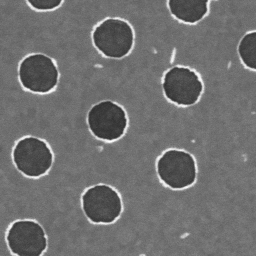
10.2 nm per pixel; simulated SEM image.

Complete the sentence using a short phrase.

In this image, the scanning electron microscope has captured holes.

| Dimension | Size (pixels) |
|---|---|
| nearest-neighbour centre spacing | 83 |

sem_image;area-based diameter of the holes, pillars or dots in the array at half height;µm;0.393